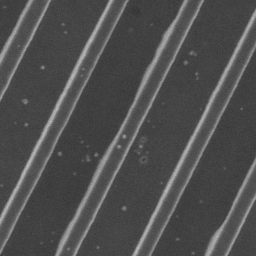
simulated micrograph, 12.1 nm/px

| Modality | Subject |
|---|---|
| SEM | lines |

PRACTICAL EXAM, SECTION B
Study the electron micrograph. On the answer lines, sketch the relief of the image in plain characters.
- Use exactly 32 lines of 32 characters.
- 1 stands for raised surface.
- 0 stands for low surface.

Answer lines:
00001100000000110000000110000000
00011100000001100000000110000000
00011000000001100000001100000000
00111000000011000000001100000001
00110000000011000000011000000001
01110000000110000000111000000011
01100000000110000000110000000111
11000000001100000001110000000110
11000000001100000001100000000110
11000000011000000011100000001100
10000000011000000011000000011100
10000000110000000111000000011000
00000000110000000110000000111000
00000001100000000110000000110000
00000001100000001100000001110000
00000011000000011100000001100000
00000011000000011000000001100000
00000110000000111000000011000000
00000110000000110000000011000000
00001100000001110000000110000000
00001100000001100000001110000000
00011000000011100000001100000001
00011000000011000000001100000001
00110000000111000000011000000011
00110000000110000000110000000011
01100000001110000000110000000111
01100000001100000000110000000110
11000000011100000001100000001110
11000000011000000001000000001100
10000000111000000011000000011100
10000000110000000110000000011000
00000001110000000110000000111000